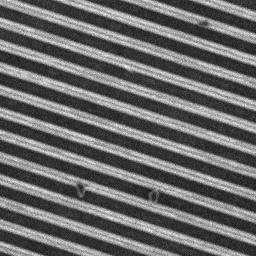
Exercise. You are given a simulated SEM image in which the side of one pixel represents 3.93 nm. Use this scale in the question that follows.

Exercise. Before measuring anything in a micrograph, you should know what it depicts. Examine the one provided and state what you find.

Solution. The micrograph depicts parallel lines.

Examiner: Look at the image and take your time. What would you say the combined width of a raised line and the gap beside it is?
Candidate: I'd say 83.7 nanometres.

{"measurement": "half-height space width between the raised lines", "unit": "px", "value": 13.7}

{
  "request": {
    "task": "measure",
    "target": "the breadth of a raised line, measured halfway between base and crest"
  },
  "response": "29.9 nm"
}